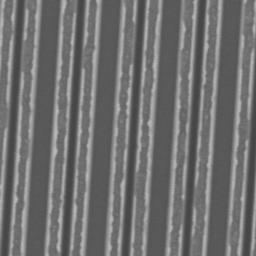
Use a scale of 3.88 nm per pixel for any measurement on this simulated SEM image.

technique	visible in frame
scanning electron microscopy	parallel lines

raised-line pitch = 120 nm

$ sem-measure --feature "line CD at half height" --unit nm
60.5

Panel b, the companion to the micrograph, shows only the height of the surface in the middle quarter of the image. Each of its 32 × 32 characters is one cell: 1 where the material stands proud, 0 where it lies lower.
11001111000000111001111000000111
11001111000000111001111000000111
11001111000001111001111000000111
11001111000001111001111000001111
11001111000001111001111000001111
11001111000001111001111000001111
11001111000001111001111000001111
11001111000001111001111000001111
10001111000001111001111000001111
10001110000001111001111000001111
10001110000001111001110000001111
10001110000001111001110000001111
10001110000001111001110000001111
10001110000001110001110000001111
10011110000001110001110000001110
10011110000001110011110000001110
10011110000001110001110000001110
10011110000001110011110000001110
10011110000011110011110000001110
10011110000011110011110000011110
10011110000011110011110000011110
10011110000011110011110000011110
10011110000011110011110000011110
00011110000011110011110000011110
00011110000011110011110000011110
00011100000011110011110000011110
00011100000011110011100000011110
00011100000011110011100000011110
00011100000011100011100000011110
00111100000011100011100000011100
00111100000011100111100000011100
00111100000011100111100000011100